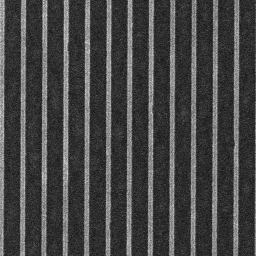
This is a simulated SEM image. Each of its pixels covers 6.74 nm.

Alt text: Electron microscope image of parallel lines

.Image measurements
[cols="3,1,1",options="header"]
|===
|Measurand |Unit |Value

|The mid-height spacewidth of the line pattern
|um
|0.114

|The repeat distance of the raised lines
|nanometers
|144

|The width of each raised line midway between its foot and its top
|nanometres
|27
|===